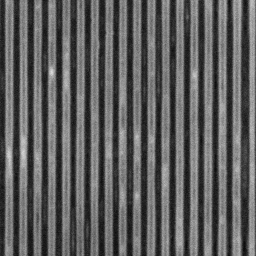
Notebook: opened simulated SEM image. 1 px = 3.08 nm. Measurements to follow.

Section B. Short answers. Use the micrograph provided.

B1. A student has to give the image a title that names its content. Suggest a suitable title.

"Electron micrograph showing parallel lines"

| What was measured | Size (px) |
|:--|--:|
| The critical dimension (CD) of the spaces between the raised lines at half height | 6.88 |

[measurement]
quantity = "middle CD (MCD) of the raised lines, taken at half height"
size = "6.88 pixels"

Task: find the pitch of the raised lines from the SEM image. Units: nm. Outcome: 44.1